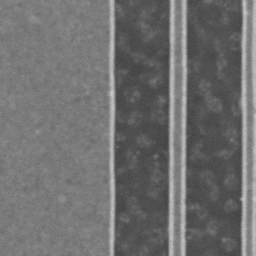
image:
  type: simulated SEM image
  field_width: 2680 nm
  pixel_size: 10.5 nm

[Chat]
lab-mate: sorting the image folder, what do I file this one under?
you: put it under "one or a few lines or trenches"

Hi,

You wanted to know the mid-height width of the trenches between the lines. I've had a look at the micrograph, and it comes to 618 nm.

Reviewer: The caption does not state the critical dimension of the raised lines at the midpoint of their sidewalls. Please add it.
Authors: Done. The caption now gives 136 nanometers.